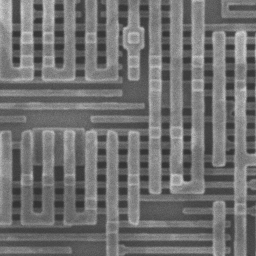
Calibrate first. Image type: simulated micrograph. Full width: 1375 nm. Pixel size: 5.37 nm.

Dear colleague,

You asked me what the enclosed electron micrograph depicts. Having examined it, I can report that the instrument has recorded wiring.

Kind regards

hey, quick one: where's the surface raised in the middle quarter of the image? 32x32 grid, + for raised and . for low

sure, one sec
+++..+++...++...+++..+++...++...
+++..++++++++...+++..+++...++...
+++..++++++++...+++..+++...++...
+++..++++++++...+++..+++...++...
.....................+++...++...
.....................+++...++...
.....................+++...++...
.....................+++...++...
.....................+++...++...
.....................+++...++...
......................++...++...
......................++...++...
......................++...++...
......................++...++...
.....................+++...++...
.....................+++...+++..
.....................+++...+++..
+++..+++...++...+++..+++...+++..
++...+++...++...+++..+++...+++..
++...+++...++...+++..+++...+++..
++...+++...++...+++..+++...+++..
++...+++...++...+++..+++...+++..
+++..+++...++...+++..+++...+++..
+++..+++...++...+++..+++..+++...
+++..+++...++...+++..+++..+++...
+++..+++...++...+++..+++..++++..
+++..+++...++...+++..+++...+++..
+++..+++...++...+++..+++...+++..
+++..+++...++...+++..+++...+++..
+++..+++...++...+++..+++...+++++
+++..+++...++...+++..+++...+++++
+++..+++...++...+++..+++...+++++